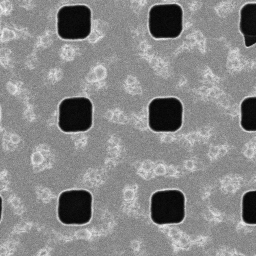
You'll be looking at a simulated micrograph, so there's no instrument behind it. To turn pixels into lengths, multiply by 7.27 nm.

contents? holes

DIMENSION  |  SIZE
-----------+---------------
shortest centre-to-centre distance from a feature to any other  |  665 nm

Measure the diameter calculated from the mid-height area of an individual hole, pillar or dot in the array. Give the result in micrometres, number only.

0.261